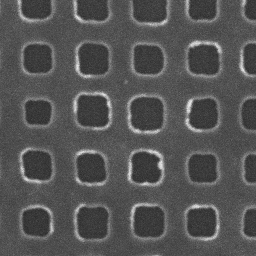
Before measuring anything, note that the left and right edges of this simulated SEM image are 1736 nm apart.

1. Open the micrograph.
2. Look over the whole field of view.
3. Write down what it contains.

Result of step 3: a regular array of holes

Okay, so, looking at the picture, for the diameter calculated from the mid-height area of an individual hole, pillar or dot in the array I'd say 220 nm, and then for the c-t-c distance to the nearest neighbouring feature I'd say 365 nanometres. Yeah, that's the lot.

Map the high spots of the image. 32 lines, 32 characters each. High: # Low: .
###....###....###....###...####.
###....###....##.....###...###..
###########..####....###.#######
################################
################################
####..####..###################.
###....###....###...####...###..
###....###....###...###....###..
###...####....###...####...###..
################################
################################
################################
##########...####...####...####.
###...####....##....####...###..
###...####....##.....###...###..
####..####...###....####...###..
################################
################################
################################
###...####...####...####...####.
###...####...###....###....####.
###....###...###....####...####.
####..####...####...####...####.
################################
################################
################################
###...####...####...####...####.
###...####....###....##....###..
###...####....###....##....###..
####..####...####...####...####.
################################
################################